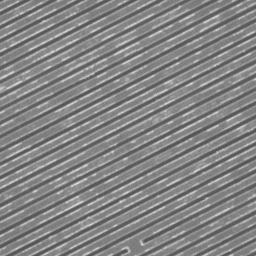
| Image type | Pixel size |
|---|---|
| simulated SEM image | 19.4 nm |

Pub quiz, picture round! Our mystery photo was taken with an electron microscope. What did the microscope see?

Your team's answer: parallel lines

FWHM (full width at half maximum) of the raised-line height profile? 0.145 µm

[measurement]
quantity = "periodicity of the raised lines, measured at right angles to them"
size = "237 nm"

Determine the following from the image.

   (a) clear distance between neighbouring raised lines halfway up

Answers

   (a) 90.9 nm